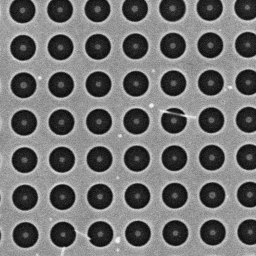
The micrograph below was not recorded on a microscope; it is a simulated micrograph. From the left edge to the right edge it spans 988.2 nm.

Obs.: an array of small figures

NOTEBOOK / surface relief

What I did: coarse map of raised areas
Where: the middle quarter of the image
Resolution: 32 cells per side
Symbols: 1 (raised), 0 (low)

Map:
11111111111111111111111111111111
11111111111111111111111111111111
01111110000111110000111110000011
00111100000111100000011100000011
00111000000011100000011100010001
00011000000011100000011100000001
00111100000011100000011110000011
00111100000111110000111110000111
11111111011111111111111111111111
11111111111111111111111111111111
11111111111111111111111111111111
01111110001111110000111111000111
00111100000011100000011110000011
00011100000011100000011100000001
00011000100011100000001100010001
00011100000011100000011100000011
00111100000111100000011110000011
01111111001111111001111111101111
11111111111111111111111111111111
11111111111111111111111111111111
11111111001111111000111111000111
00111110000111110000011110000011
00111100000011100000011110000001
00011100000011100000001100010001
00011100000011100000001100000001
00111100000011100000011110000011
00111110000111110000111111000111
11111111111111111111111111111111
11111111111111111111111111111111
11111111111111111111111111111111
01111110000111110000111111000011
00111100000011100000011110000001